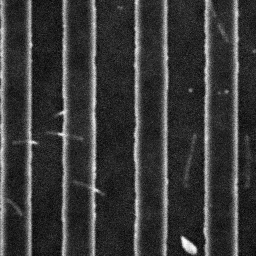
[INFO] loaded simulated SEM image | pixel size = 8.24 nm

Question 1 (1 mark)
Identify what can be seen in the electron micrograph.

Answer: lines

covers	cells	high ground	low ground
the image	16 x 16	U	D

UUDDUUDDUUDDDUUD
UUDDUUDDUUDDDUUD
UUDDUUDDUUDDDUUD
UUDDUUDDUUDDDUUD
UUDDUUDDUUDDDUUD
UUDDUUDDUUDDDUUD
UUDDUUDDUUDDDUUD
UUDDUUDDUUDDDUUD
UUDDUUDDUUDDDUUD
UUDDUUDDUUDDDUUD
UUDDUUDDUUDDDUUD
UUDDUUDDUUDDDUUD
UUDDUUDDUUDDDUUD
UUDDUUDDUUDDDUUD
UUDDUUDDUUDDDUUD
UUDDUUDDUUDDDUUD